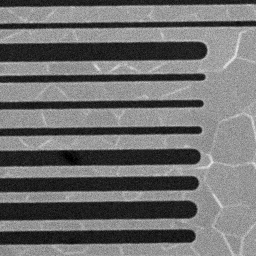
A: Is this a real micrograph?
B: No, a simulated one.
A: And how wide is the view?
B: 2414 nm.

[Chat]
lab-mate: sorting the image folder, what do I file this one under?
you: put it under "groups of lines, slits or small figures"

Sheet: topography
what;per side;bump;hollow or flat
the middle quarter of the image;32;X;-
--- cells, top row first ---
XXXXXXXXXXXXXXXXXXXXXXXXXXXXXXXX
XXXXXXXXXXXXXXXXXXXXXXXXXXXXXXXX
XXXX-XX-------------------------
--------------------------------
---------------------------XXXXX
XXXXXXXXXXXXXXXXXXXXXXXXXXXXXXXX
XXXXXXXXXXXXXXXXXXXXXXXXXXXXXXXX
XXXXXXXXXXXXXXXXXXXXXXXXXXXXXXXX
XXXXXXXXXXXXXXXXXXXXXXXXXXXXXXXX
--------------------------------
--------------------------------
-XXXXXXXXXXXXXXXXXXXXXXXXXXXXXXX
XXXXXXXXXXXXXXXXXXXXXXXXXXXXXXXX
XXXXXXXXXXXXXXXXXXXXXXXXXXXXXXXX
XXXXXXXXXXXXXXXXXXXXXXXXXXXXXXXX
XXXXXXXXXXXXXXXXXXXXXXX---------
--------------------------------
--------------------------------
XXXXXXXXXXXXXXXXXXXXXXXXXXXXXXXX
XXXXXXXXXXXXXXXXXXXXXXXXXXXXXXXX
XXXXXXXXXXXXXXXXXXXXXXXXXXXXXXXX
--------------------------------
--------------------------------
--------------------------------
--------------------------------
------------------XXXXXXXXXXXXXX
XXXXXXXXXXXXXXXXXXXXXXXXXXXXXXXX
XXXXXXXXXXXXXXXXXXXXXXXXXXXXXXXX
--------------------------------
--------------------------------
--------------------------------
--------------------------------